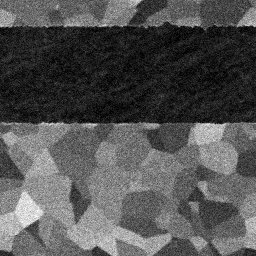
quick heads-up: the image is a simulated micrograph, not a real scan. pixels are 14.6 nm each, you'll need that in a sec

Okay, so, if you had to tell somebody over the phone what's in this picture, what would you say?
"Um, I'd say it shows one or a few lines or trenches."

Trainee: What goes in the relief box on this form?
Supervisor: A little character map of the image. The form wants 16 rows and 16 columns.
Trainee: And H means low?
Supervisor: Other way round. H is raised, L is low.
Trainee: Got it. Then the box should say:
HHHHHHHHHHHHHHHH
HHHHHHHHHHLHHHHH
LLLLLLLLLLLLLLLL
LLLLLLLLLLLLLLLL
LLLLLLLLLLLLLLLL
LLLLLLLLLLLLLLLL
LLLLLLLLLLLLLLLL
LLLLLLLLLLLLLLLL
HHHHHHHHHHHHHHHH
HHHHHHHHHHHHHHHH
HHHHHHHHHHHHHHHH
HHHHHHHHHHHHHHHH
HHHHHHHHHHHHHHHH
HHHHHHHHHHHHHHHH
HHHHHHHHHHHHHHHH
HHHHHHHHHHHHHHHH